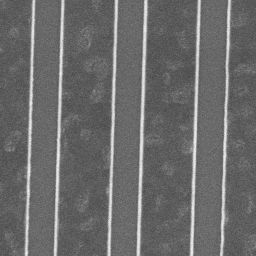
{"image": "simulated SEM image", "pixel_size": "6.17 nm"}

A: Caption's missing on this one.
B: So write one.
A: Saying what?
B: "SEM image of one or a few lines or trenches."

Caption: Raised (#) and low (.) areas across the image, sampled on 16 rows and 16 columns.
##..###..###..##
##..###..###..##
##..###..###..##
##..###..###..##
##..###..###..##
##..###..###..##
##..###..###..##
##..###..###..##
##..###..###..##
##..###..###..##
##..###..###..##
##..###..###..##
##..###..###..##
##..###..###..##
##..###..###..##
##.####..###..##